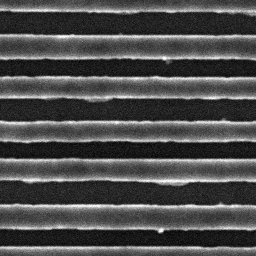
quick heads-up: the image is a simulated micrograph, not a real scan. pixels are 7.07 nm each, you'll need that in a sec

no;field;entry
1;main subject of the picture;lines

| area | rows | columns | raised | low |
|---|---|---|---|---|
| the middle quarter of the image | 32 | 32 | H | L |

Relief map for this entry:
LLLLLLLLLLLLLLLLLLLLLLLLLLLLLLLL
LLLLLLLLLLLLLLLLLLLLLLLLLLLLLLLL
LLLLLLLLLLLLLLLLLLLLLLLLLLLLLLLL
HHHHHHHHHHHHHHHHHHHHHHHHHHLHHHHH
HHHHHHHHHHHHHHHHHHHHHHHHHHHHHHHH
HHHHHHHHHHHHHHHHHHHHHHHHHHHHHHHH
HHHHHHHHHHHHHHHHHHHHHHHHHHHHHHHH
HHHHHHHHHHHHHHHHHHHHHHHHHHHHHHHH
LLLLLLHLLLLLLLLLLLLLLLLLLLLLLLHH
LLLLLLLLLLLLLLLLLLLLLLLLLLLLLLLL
LLLLLLLLLLLLLLLLLLLLLLLLLLLLLLLL
LLLLLLLLLLLLLLLLLLLLLLLLLLLLLLLL
LLLLLLLLLLLLLLLLLLLLLLLLLLLLLLLL
LLLLLLLLLLLLLLLLLLLLLLLLLLLLLLLL
LLLLHHHHHHHHHHHLLHLLHHLLHHHHHHHL
HHHHHHHHHHHHHHHHHHHHHHHHHHHHHHHH
HHHHHHHHHHHHHHHHHHHHHHHHHHHHHHHH
HHHHHHHHHHHHHHHHHHHHHHHHHHHHHHHH
HHHHHHHHHHHHHHHHHHHHHHHHHHHHHHHH
LLLLLLLLLLLLLLLLLLLLLLLLLLLLLLLL
LLLLLLLLLLLLLLLLLLLLLLLLLLLLLLLL
LLLLLLLLLLLLLLLLLLLLLLLLLLLLLLLL
LLLLLLLLLLLLLLLLLLLLLLLLLLLLLLLL
LLLLLLLLLLLLLLLLLLLLLLLLLLLLLLLL
HHHHHHHHHHHHHHHHHHHHHHHHHHHHHHHH
HHHHHHHHHHHHHHHHHHHHHHHHHHHHHHHH
HHHHHHHHHHHHHHHHHHHHHHHHHHHHHHHH
HHHHHHHHHHHHHHHHHHHHHHHHHHHHHHHH
HHHHHHHHHHHHHHHHHHHHHHHHHHHHHHHH
LLLLLLLLLLLLLLLLLLLLLLLLLLLLLLLL
LLLLLLLLLLLLLLLLLLLLLLLLLLLLLLLL
LLLLLLLLLLLLLLLLLLLLLLLLLLLLLLLL